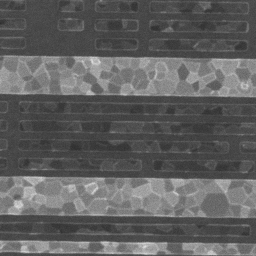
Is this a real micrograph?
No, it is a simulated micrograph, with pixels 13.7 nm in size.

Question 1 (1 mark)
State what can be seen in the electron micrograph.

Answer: groups of lines, slits or small figures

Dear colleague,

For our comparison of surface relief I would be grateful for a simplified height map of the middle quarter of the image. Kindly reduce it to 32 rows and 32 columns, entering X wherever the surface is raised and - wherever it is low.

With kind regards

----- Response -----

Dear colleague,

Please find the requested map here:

XXXXXXXXXXXXXXXXXXXXXXXXXXXXXXXX
XXXXXXXXXXXXXXXXXXXXXXXXXXXXXXXX
XXXXXXXXXXXXXXXXXXXXXXXXXXXXXXXX
XXXXXXXXXXXXXXXXXXXXXXXXXXXXXXXX
XXXXXXXXXXXXXXXXXXXXXXXXXXXXXXXX
XXXXXXXXXXXXXXXXXXXXXXXXXXXXXXXX
XXXXXXXXXXXXXXXXXXXXXXXXXXXXXXXX
-----XXX-------XXXXXXXXXXXXXXXXX
--------------------------------
--------------------------------
XXXXXXXXXXXXXXXXXXXXXXXXXXXXXXXX
XXXXXXXXXXXXXXXXXXXXXXXXXXXXXXXX
----------------------------XX--
--------------------------------
XXXXXXXXXXXXXX-XX---------------
XXXXXXXXXXXXXXXXXXXXXXXXXXXXXXXX
XXXXXXXXXXXXXXXXXXXXXXXXXXXXXXXX
--------------------------------
--------------------------------
XXXXXXXXXXXXXXXXXXXXXXXXX----XX-
XXXXXXXXXXXXXXXXXXXXXXXXXXXXXXXX
XXXXXXXXXXXXXXXXXXXXXXXXXXXXXXXX
--------------------------------
--------------------------------
XXXXXXXXXXXXXXXXXXX---XXXXXXXXXX
XXXXXXXXXXXXXXXXXXX---XXXXXXXXXX
-----------------------XXXXXXXXX
--------------------------------
XXX-----------------------------
XXXXXXXXXXXXXXXXXXXXXXXXXXXXXXXX
XXXXXXXXXXXXXXXXXXXXXXXXXXXXXXXX
XXXXXXXXXXXXXXXXXXXXXXXXXXXXXXXX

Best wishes